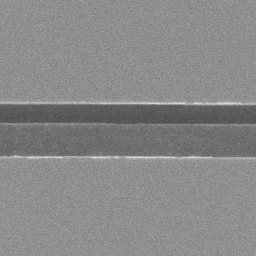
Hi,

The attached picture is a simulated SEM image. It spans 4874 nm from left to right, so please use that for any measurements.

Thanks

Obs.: lines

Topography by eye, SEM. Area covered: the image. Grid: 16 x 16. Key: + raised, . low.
++++++++++++++++
++++++++++++++++
++++++++++++++++
++++++++++++++++
++++++++++++++++
++++++++++++++++
................
................
................
................
++++++++++++++++
++++++++++++++++
++++++++++++++++
++++++++++++++++
++++++++++++++++
++++++++++++++++